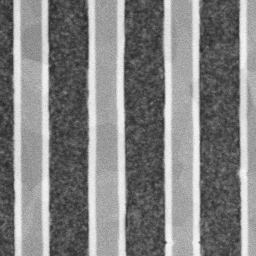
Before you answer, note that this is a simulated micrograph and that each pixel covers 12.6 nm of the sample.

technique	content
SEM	one or a few lines or trenches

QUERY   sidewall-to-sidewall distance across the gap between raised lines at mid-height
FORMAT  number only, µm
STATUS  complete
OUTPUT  0.585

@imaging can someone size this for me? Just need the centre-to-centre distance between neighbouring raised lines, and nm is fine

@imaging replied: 947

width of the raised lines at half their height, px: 28.9